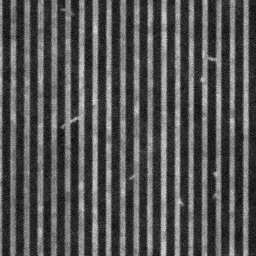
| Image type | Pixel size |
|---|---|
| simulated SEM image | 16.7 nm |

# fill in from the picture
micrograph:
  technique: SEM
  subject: parallel lines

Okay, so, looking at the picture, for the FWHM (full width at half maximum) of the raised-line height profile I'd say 54.3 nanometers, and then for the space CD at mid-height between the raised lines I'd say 176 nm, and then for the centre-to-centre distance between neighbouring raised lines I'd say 229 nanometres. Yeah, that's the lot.